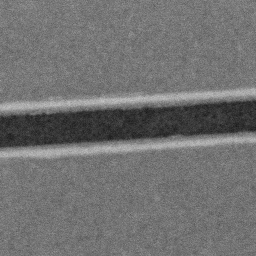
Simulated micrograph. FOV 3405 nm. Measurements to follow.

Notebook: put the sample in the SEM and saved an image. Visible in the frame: one or a few lines or trenches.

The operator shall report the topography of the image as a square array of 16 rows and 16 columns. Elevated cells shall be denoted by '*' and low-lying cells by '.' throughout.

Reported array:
****************
****************
****************
****************
****************
****************
****............
................
................
....************
****************
****************
****************
****************
****************
****************